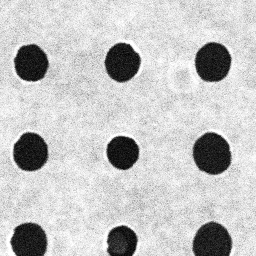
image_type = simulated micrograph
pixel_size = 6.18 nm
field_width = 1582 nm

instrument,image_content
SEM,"holes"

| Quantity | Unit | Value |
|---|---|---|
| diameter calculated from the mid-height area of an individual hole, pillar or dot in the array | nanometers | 231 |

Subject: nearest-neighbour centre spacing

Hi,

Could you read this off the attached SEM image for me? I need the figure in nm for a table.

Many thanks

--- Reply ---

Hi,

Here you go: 553